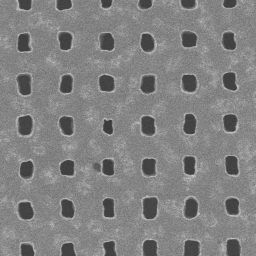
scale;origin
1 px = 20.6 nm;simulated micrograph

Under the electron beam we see a regular array of holes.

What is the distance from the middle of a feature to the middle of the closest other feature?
840 nm